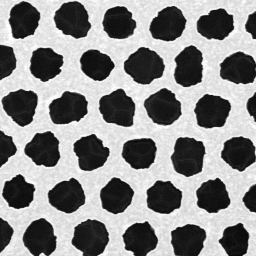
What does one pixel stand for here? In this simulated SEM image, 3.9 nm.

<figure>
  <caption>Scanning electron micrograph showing a regular array of holes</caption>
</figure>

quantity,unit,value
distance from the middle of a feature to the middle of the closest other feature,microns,0.183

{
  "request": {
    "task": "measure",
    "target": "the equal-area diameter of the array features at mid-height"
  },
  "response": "137 nanometres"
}